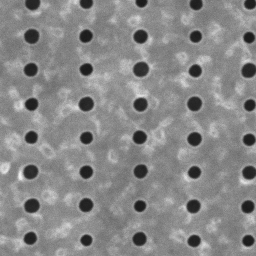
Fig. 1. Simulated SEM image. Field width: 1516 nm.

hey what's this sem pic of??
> a regular array of holes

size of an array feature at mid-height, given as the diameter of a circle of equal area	0.0816	µm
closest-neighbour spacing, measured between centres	198	nanometres